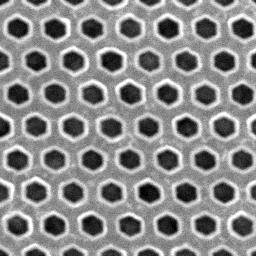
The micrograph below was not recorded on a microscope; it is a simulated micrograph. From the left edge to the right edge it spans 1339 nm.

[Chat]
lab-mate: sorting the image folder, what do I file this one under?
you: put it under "a regular array of holes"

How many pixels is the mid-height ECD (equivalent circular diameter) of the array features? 22.1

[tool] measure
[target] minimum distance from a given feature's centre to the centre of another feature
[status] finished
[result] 195 nanometers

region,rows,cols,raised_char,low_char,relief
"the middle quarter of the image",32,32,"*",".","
.....****......****.....****....
*...*******...******...******...
********************************
********************************
********************************
*****....******...******...*****
****......****.....****......***
.***......****......***......***
.***......****......***......***
*****.....*****....*****....****
********************************
********************************
********************************
*..********..*******..*******...
.....****.....****......****....
.....****......***......****....
.....****......***......****....
.....****......****.....****....
**.********..********.********..
********************************
********************************
******..*******...*******..*****
****.....*****.....****.....****
.***......***......****......***
.***......****......***......***
****......****.....*****.....***
******...*******.********..*****
********************************
********************************
**.***************************.*
.....****.....*****....*****....
.....****......***......****....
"